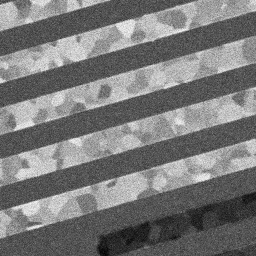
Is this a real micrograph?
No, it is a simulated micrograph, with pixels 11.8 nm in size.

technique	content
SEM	parallel lines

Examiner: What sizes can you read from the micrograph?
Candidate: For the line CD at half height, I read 294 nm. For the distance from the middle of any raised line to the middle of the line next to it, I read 586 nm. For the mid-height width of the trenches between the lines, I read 0.288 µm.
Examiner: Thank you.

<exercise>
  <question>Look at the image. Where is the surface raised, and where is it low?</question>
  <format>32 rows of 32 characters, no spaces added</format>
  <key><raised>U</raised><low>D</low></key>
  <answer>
DUUUUUUUUUUUDDDDDDDDDDDUUUUUUUUU
UUUUUUUUDDDDDDDDDDDDUUUUUUUUUUUD
UUUUUDDDDDDDDDDDUUUUUUUUUUUUDDDD
UDDDDDDDDDDDDUUUUUUUUUUUDDDDDDDD
DDDDDDDDDUUUUUUUUUUUUDDDDDDDDDDD
DDDDDDUUUUUUUUUUUDDDDDDDDDDDUUUU
DDUUUUUUUUUUUUDDDDDDDDDDDUUUUUUU
UUUUUUUUUUDDDDDDDDDDDDUUUUUUUUUU
UUUUUUUDDDDDDDDDDDUUUUUUUUUUUDDD
UUUDDDDDDDDDDDUUUUUUUUUUUUDDDDDD
DDDDDDDDDDDUUUUUUUUUUUDDDDDDDDDD
DDDDDDDUUUUUUUUUUUUDDDDDDDDDDDUU
DDDDUUUUUUUUUUUDDDDDDDDDDDUUUUUU
UUUUUUUUUUUUDDDDDDDDDDDUUUUUUUUU
UUUUUUUUDDDDDDDDDDDUUUUUUUUUUUUD
UUUUUDDDDDDDDDDDUUUUUUUUUUUDDDDD
UDDDDDDDDDDDUUUUUUUUUUUUDDDDDDDD
DDDDDDDDDUUUUUUUUUUUDDDDDDDDDDDD
DDDDDUUUUUUUUUUUUDDDDDDDDDDDUUUU
DDUUUUUUUUUUUDDDDDDDDDDDDUUUUUUU
UUUUUUUUUUDDDDDDDDDDDUUUUUUUUUUU
UUUUUUDDDDDDDDDDDUUUUUUUUUUUUDDD
UUUDDDDDDDDDDDUUUUUUUUUUUUDDDDDD
DDDDDDDDDDUUUUUUUUUUUUDDDDDDDDDD
DDDDDDDUUUUUUUUUUUDDDDDDDDDDDDUU
DDDUUUUUUUUUUUUDDDDDDDDDDDUUUUUU
UUUUUUUUUUUDDDDDDDDDDDDUUUUUUUUU
UUUUUUUUDDDDDDDDDDDUUUUUUUUUUUDD
UUUUDDDDDDDDDDDDUUUUUUUUUUUDDDDD
UDDDDDDDDDDDDUUUUUUUUUUDDDDDDDDD
DDDDDDDDDDDDUUUUUUUUDDDDDDDDDDDU
DDDDDDDDDDDDUUUUDDDDDDDDDDDDUUUU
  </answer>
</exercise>